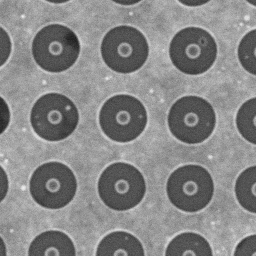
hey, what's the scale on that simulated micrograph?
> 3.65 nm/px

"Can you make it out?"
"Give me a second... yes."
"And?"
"an array of small figures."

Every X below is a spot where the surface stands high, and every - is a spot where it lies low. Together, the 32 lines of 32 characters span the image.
XXXXXXXXXXXXXXX--XXXXXX---XXXXX-
XXXXXXXXXXXXXXXXXXXXXXXXXXXXXXXX
XXXXXXXXXXXXXXXXXXXXXXXXXXXXXXXX
XXXXX----XXXXX---XXXXXX--XXXXXXX
-XXX------XXX-----XXXX-----XXX--
-XXX------XXX------XX------XXX--
-XXX--X---XXX--X---XX--XX--XXX--
-XXX------XXX-----XXX------XXX--
XXXXX----XXXXX----XXXX----XXXX--
XXXXXXXXXXXXXXXXXXXXXXXXXXXXXXXX
XXXXXXXXXXXXXXXXXXXXXXXXXXXXXXXX
XXXXXXXXXXXXXXXXXXXXXXXXXXXXXXXX
-XXXX----XXXX----XXXXX----XXXXX-
-XXX------XXX-----XXX------XXX--
-XXX--XX--XX---X--XXX--X---XX---
-XXX------XX------XXX--X---XX---
XXXX-----XXXX-----XXX------XXX--
XXXXX---XXXXXX---XXXXX----XXXXX-
XXXXXXXXXXXXXXXXXXXXXXXXXXXXXXXX
XXXXXXXXXXXXXXXXXXXXXXXXXXXXXXXX
XXXXX---XXXXXX--XXXXXXXXXXXXXXXX
-XXX-----XXXX-----XXXX----XXXX--
-XXX--X---XX------XXX------XX---
-XXX--X---XX---X--XXX--XX--XX---
-XXX-----XXX------XXX------XX---
XXXXX----XXXX----XXXXX----XXXX--
XXXXXXXXXXXXXXXXXXXXXXX--XXXXXX-
XXXXXXXXXXXXXXXXXXXXXXXXXXXXXXXX
XXXXXXXXXXXXXXXXXXXXXXXXXXXXXXXX
XXXXX----XXXX----XXXXX---XXXXXX-
-XXX-----XXX------XXX-----XXXX--
-XX---X--XXX---X--XXX--X---XX---